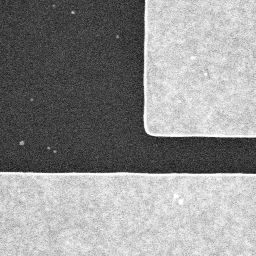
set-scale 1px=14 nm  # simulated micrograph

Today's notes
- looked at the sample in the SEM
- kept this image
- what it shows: wiring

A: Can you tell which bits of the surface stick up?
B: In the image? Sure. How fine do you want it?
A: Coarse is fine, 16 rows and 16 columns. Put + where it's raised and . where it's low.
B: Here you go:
.........+++++++
.........+++++++
.........+++++++
.........+++++++
.........+++++++
.........+++++++
.........+++++++
.........+++++++
.............+++
................
................
++++++++++++++++
++++++++++++++++
++++++++++++++++
++++++++++++++++
++++++++++++++++